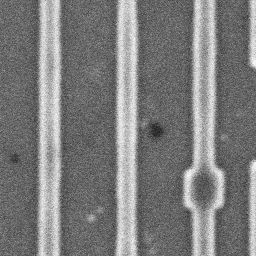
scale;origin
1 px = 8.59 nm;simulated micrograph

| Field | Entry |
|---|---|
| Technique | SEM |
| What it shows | wiring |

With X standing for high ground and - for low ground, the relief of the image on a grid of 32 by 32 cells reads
-----XX--------XX--------XX----X
-----XX--------XX--------XX----X
-----XX--------XX-------XXX----X
-----XX--------XX-------XXX----X
-----XX--------XX-------XXX----X
-----XX--------XX-------XXX----X
-----XX--------XX-------XXX----X
-----XX--------XX-------XXX----X
-----XX--------XX-------XXX-----
-----XX--------XX-------XXX-----
-----XX--------XX-------XXX-----
-----XX--------XX-------XXX-----
-----XX--------XX-------XXX-----
-----XX--------XX-------XXX-----
-----XX--------XX-------XXX-----
-----XX--------XX-------XXX-----
-----XX--------XX-------XXX-----
-----XX--------XX-------XXX-----
-----XX--------XX-------XXX-----
-----XX--------XX-------XXX-----
-----XX--------XX-------XXX-----
-----XX--------XX------XXXXX---X
-----XX--------XX------XXXXX---X
-----XX--------XX------XXXXX---X
-----XX--------XX------XXXXX---X
-----XX--------XX------XXXXX---X
-----XX--------XX-------XXX----X
-----XX--------XX-------XXX----X
-----XX--------XX-------XXX----X
-----XX--------XX-------XXX----X
-----XX--------XX-------XXX----X
-----XX--------XX-------XXX----X